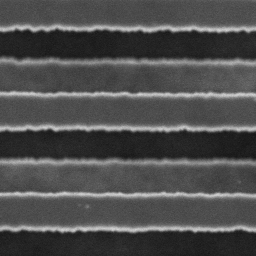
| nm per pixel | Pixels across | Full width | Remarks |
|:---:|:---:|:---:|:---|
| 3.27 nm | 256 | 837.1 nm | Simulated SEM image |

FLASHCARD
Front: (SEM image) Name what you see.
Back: lines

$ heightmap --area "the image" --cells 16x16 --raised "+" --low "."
++++++++++++++++
++++++++++++++++
................
................
++++++++++++++++
++++++++++++++++
++++++++++++++++
++++++++++++++++
................
................
++++++++++++++++
++++++++++++++++
++++++++++++++++
++++++++++++++++
................
................